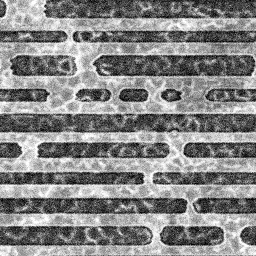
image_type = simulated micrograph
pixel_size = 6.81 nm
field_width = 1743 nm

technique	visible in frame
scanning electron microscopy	parallel lines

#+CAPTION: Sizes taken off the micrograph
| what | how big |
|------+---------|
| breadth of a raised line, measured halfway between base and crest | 11.7 px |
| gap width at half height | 0.111 um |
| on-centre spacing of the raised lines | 190 nm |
